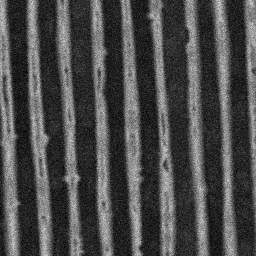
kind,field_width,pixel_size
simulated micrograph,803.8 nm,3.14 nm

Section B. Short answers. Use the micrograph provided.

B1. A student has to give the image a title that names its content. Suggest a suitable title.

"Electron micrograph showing parallel lines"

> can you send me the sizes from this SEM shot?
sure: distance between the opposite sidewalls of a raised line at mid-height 33.3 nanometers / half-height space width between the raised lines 0.0631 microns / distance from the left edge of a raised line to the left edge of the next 98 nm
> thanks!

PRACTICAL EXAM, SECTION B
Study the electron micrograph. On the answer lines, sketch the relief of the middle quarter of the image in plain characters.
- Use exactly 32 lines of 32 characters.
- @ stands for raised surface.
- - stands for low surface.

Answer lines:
@-------@@-----@@@-----@@------@
@------@@@-----@@@-----@@------@
@@------@@-----@@@-----@@------@
@@------@@-----@@@-----@@------@
@@------@@-----@@@-----@@------@
@@------@@-----@@@-----@@------@
@@------@@-----@@@-----@@------@
@@------@@-----@@@-----@@------@
@@------@@-----@@@-----@@------@
@@------@@-----@@@-----@@------@
@@------@@-----@@@@-----@@-----@
@@------@@@----@@@@-----@@-----@
@@------@@@----@@@@-----@@-----@
@@@-----@@@----@@@@-----@@-----@
@@@-----@@@----@@@@-----@@------
@@@-----@@@----@@@@-----@@------
@@@-----@@@----@@@@-----@@------
-@@-----@@@----@@@@-----@@------
-@@-----@@@----@@@@-----@@------
-@@-----@@@----@@@@-----@@------
@@@-----@@@----@@@@-----@@------
@@@-----@@@-----@@@-----@@@-----
-@@-----@@@-----@@@-----@@@-----
-@@-----@@@-----@@@-----@@@-----
-@@------@@-----@@@-----@@@-----
-@@-----@@@-----@@@-----@@@-----
-@@-----@@@-----@@@-----@@@-----
-@@-----@@@-----@@@-----@@@-----
@@@@-----@@-----@@@-----@@@-----
-@@-----@@@-----@@@-----@@@-----
-@@-----@@@-----@@@-----@@@-----
-@@-----@@@-----@@@-----@@@-----